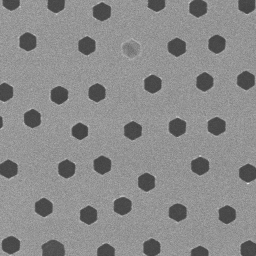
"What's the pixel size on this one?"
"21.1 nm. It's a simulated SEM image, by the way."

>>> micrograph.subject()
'a regular array of holes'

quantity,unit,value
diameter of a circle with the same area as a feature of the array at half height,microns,0.386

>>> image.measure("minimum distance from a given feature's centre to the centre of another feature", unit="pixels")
39.4